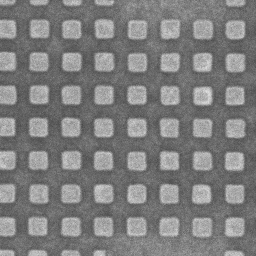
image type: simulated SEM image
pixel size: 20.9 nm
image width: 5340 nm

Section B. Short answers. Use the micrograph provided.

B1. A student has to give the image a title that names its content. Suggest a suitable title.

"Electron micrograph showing a regular array of raised bodies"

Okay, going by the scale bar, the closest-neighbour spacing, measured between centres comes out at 32.4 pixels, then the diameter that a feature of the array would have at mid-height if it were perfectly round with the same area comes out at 422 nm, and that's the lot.